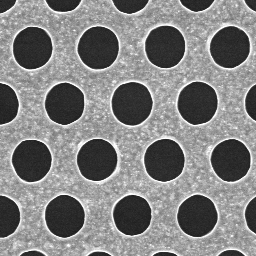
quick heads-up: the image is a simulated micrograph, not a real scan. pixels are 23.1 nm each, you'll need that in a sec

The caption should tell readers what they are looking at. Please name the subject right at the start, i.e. a regular array of holes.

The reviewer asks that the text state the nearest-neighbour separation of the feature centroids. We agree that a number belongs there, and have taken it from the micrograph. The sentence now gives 1490 nm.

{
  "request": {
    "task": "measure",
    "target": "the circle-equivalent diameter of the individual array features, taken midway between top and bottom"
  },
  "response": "0.959 µm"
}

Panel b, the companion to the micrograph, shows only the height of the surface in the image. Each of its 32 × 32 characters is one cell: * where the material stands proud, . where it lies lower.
..****....****....*****....****.
.**************..*******.*******
********************************
***..******..*******..******..**
**....****.....***.....****....*
**.....***.....***.....***.....*
**.....***.....***.....***.....*
**....****....*****....****....*
***..******..*******.***********
********************************
.******..*******..******..******
..****....****.....****....****.
..****.....***.....***.....****.
..****.....***.....***.....****.
..****....****.....****....****.
*******..*******..******.*******
********************************
***********..*******..******..**
**....****....****.....****....*
*.....****.....***.....***.....*
*.....****.....***.....***.....*
**....****....****.....****....*
***..******..******..*******..**
********************************
.******..*******..******..******
..****....****.....****....****.
..****.....***.....***.....****.
..****.....***.....***.....****.
..****....*****...*****....****.
.******..***************.*******
********************************
***..*******.*******.*******..**